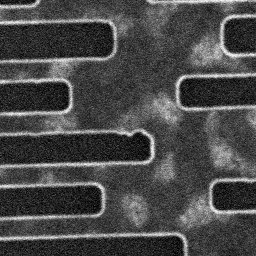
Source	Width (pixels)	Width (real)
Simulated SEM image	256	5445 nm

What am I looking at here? parallel lines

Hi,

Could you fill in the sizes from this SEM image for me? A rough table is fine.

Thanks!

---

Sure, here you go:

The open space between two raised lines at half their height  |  31.6 pixels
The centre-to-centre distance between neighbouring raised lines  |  1120 nm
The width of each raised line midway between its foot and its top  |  444 nm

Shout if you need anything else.